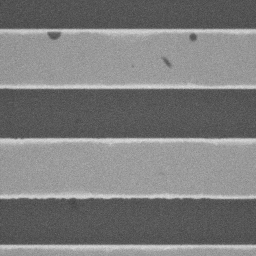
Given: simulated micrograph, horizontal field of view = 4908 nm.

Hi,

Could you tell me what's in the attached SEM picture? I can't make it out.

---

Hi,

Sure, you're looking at lines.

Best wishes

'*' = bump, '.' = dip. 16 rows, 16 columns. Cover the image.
................
................
****************
****************
****************
****************
................
................
................
****************
****************
****************
................
................
................
****************